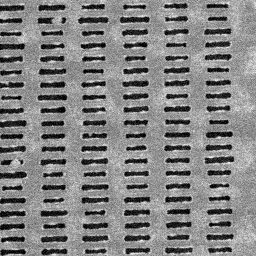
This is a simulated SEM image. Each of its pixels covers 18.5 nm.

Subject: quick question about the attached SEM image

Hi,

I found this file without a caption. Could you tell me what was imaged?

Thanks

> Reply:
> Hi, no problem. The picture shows a regular array of holes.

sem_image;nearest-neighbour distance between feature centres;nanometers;236